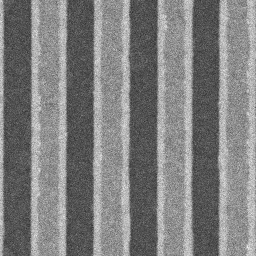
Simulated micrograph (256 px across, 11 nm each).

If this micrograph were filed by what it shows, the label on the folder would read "one or a few lines or trenches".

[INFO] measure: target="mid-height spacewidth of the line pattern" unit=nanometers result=378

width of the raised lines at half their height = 310 nm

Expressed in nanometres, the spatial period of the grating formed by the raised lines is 690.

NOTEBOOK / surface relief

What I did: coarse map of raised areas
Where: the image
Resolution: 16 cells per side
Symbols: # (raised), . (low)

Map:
..##..##..##..##
..##..##..##..##
..##..##..##..##
..##..##..##..##
..##..##..##..##
..##..##..##..##
..##..##..##..##
..##..##..##..##
..##..##..##..##
..##..##..##..##
..##..##..##..##
..##..##..##..##
..##..##..##..##
..##..##..##..##
..##..##..##..##
..##..##..##..##